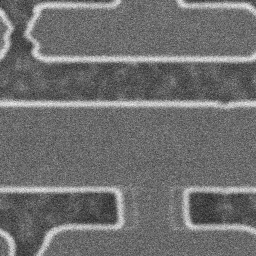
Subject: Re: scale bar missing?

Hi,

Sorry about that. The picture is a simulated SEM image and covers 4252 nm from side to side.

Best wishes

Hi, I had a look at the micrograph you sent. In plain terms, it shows one or a few lines or trenches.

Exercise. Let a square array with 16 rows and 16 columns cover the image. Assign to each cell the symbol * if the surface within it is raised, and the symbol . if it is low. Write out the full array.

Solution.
...*************
..**************
..**************
..**************
................
................
................
****************
****************
****************
****************
****************
.......*****....
.......*****....
...*************
*..*************